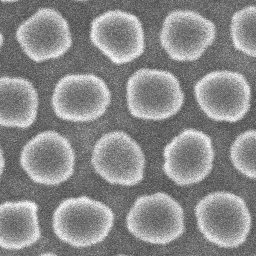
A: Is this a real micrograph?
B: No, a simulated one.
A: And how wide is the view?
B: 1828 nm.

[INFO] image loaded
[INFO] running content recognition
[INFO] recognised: a regular array of raised bodies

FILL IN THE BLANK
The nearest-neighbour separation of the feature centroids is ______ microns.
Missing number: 0.489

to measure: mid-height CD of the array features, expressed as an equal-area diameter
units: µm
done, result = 0.363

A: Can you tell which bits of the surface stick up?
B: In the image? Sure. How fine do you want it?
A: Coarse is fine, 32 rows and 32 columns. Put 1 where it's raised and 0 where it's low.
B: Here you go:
00000000000000000000000000000000
00000110000000000000000000000011
00011111000011111000011111000111
00111111000011111000111111100111
00111111100011111100111111100111
00011111100011111100111111000011
00011111000001111000011110000001
00000000000000110000000100000000
00000000000000000000000000000000
00000000000000000111100000111100
11110001111110001111110001111110
11110001111110001111111001111110
11111001111111001111111001111110
11111001111110001111110001111110
11110000111100000111100000111100
11110000000000000000000000000000
00000010000000000000000000000000
00001111000001110000001111000011
00011111100011111000011111000111
00011111100011111100011111100111
00011111100011111100011111000111
00011111100011111100011111000011
00000111000000111000001110000000
00000000000000000000000000000000
00000000000000000001100000111000
01110000111100000111110001111100
11110001111111001111111001111110
11111001111111001111111001111110
11111001111111001111111001111110
11111001111110000111110000111110
11110000011000000000000000011100
00000000000000000000000000000000